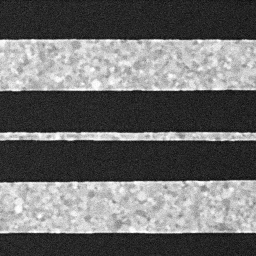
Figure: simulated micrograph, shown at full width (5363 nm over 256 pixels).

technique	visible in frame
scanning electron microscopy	lines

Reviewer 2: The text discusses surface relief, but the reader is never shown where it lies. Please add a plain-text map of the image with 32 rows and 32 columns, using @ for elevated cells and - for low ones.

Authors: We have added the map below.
--------------------------------
--------------------------------
--------------------------------
--------------------------------
--------------------------------
@@@@@@@@@@@@@@@@@@@@@@@@@@@@@@@@
@@@@@@@@@@@@@@@@@@@@@@@@@@@@@@@@
@@@@@@@@@@@@@@@@@@@@@@@@@@@@@@@@
@@@@@@@@@@@@@@@@@@@@@@@@@@@@@@@@
@@@@@@@@@@@@@@@@@@@@@@@@@@@@@@@@
@@@@@@@@@@@@@@@@@@@@@@@@@@@@@@@@
--------------------------------
--------------------------------
--------------------------------
--------------------------------
--------------------------------
--------------------------------
--------------------------@@@@--
--------------------------------
--------------------------------
--------------------------------
--------------------------------
--------------------------------
@@@@@@@@@@@@@@@@@@@@@@@@@@@@@@@@
@@@@@@@@@@@@@@@@@@@@@@@@@@@@@@@@
@@@@@@@@@@@@@@@@@@@@@@@@@@@@@@@@
@@@@@@@@@@@@@@@@@@@@@@@@@@@@@@@@
@@@@@@@@@@@@@@@@@@@@@@@@@@@@@@@@
@@@@@@@@@@@@@@@@@@@@@@@@@@@@@@@@
--------------------------------
--------------------------------
--------------------------------